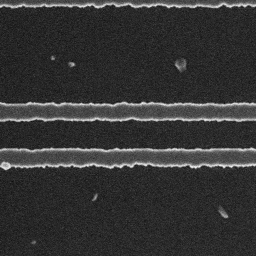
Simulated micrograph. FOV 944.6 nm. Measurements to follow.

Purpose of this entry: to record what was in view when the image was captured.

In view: lines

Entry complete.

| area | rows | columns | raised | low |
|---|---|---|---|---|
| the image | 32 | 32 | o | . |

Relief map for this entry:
oooooooooooooooooooooooooooooooo
................................
................................
................................
................................
................................
................................
................................
......................o.........
................................
................................
................................
................................
oooooooooooooooooooooooooooooooo
oooooooooooooooooooooooooooooooo
................................
................................
................................
................................
oooooooooooooooooooooooooooooooo
oooooooooooooooooooooooooooooooo
................................
................................
................................
................................
................................
................................
................................
................................
................................
................................
................................